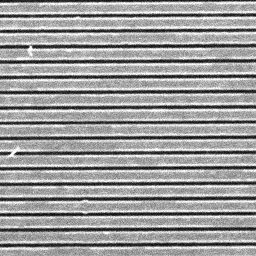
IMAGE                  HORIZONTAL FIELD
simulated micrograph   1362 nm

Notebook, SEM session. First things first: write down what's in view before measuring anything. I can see parallel lines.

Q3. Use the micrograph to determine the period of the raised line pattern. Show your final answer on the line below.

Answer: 81.2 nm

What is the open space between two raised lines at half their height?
24.6 nm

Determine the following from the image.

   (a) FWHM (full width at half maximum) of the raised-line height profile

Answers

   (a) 59.8 nm